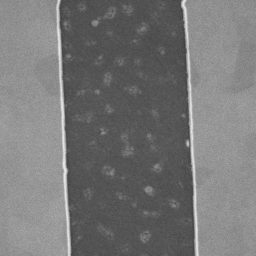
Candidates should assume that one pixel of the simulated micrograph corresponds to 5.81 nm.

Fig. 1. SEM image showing one or a few lines or trenches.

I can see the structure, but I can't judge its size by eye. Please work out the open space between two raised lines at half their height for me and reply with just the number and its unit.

743 nm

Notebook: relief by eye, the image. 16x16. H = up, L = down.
HHHHLLLLLLLLHHHH
HHHHLLLLLLLLHHHH
HHHHLLLLLLLLHHHH
HHHHLLLLLLLLHHHH
HHHHLLLLLLLLHHHH
HHHHLLLLLLLLHHHH
HHHHLLLLLLLLHHHH
HHHHLLLLLLLLHHHH
HHHHLLLLLLLLHHHH
HHHHLLLLLLLLHHHH
HHHHLLLLLLLLHHHH
HHHHLLLLLLLLHHHH
HHHHLLLLLLLLHHHH
HHHHLLLLLLLLHHHH
HHHHLLLLLLLLHHHH
HHHHLLLLLLLLHHHH